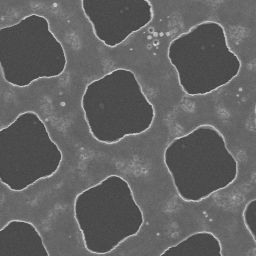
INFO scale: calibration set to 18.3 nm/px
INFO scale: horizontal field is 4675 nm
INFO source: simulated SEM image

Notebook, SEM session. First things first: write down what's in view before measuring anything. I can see holes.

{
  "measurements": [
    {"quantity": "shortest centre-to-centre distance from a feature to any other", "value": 1.83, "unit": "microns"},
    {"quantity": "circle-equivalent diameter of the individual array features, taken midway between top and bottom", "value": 1230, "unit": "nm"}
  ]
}